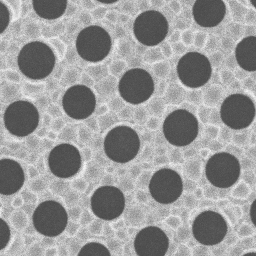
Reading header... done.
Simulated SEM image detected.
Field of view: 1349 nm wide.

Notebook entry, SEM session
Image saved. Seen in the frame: a regular array of holes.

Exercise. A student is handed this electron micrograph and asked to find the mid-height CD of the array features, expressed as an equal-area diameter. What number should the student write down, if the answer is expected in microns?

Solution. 0.187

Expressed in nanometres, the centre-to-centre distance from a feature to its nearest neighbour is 314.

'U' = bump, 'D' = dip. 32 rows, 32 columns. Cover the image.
UUUUDDDDUUUUUUUUUUUUUUUUDDDDUUUU
DUUUDDDDUUUUUUUUUUDDUUUUDDDDUUUU
DUUUUUUUUUUUUUUUUDDDDUUUDDDDUUUU
DUUUUUUUUUUDDUUUUDDDDUUUUUUUUUUU
UUUUUUUUUUDDDDUUUDDDDUUUUUUUUUUU
UUUDDDUUUUDDDDUUUUDDUUUUUUUUUUDD
UUDDDDDUUUDDDDUUUUUUUUUUDUUUUDDD
UUDDDDDUUUUDDUUUUUUUUUDDDDUUUUDD
UUDDDDDUUUUUUUUUUUUUUUDDDDUUUUDD
UUUDDDUUUUUUUUUDDDDUUUDDDDUUUUUU
UUUUUUUUUUUUUUUDDDDUUUUDDDUUUUUU
UUUUUUUUDDDDUUUDDDDUUUUUUUUUUUUU
UUUUUUUUDDDDUUUUDDUUUUUUUUUUDDDU
UDDDUUUUDDDDUUUUUUUUUUUUUUUUDDDD
DDDDDUUUUDDUUUUUUUUUUDDDUUUUDDDD
UDDDDUUUUUUUUUUUUUUUDDDDDUUUDDDU
UDDDUUUUUUUUUUDDDUUUDDDDDUUUUUUU
UUUUUUUUUUUUUDDDDUUUUDDDUUUUUUUU
UUUUUUUDDDUUUDDDDUUUUUUUUUUUUUUU
UUUUUUDDDDUUUDDDDUUUUUUUUUDDDUUU
DDUUUUDDDDUUUUUUUUUUUUUUUUDDDDUU
DDDUUUDDDDUUUUUUUUUUDDUUUUDDDDUU
DDDUUUUUUUUUUUUUUUUDDDDUUUDDDDUU
DDDUUUUUUUUUDDDUUUUDDDDUUUUUUUUU
UUUUUUUUUUUDDDDDUUUDDDUUUUUUUUUU
UUUUUDDDUUUDDDDDUUUUUUUUUUUUUUUD
UUUUDDDDUUUUDDDUUUUUUUUUUDDUUUUD
UUUUDDDDUUUUUDUUUUUUUUUUDDDDUUUD
DUUUDDDDUUUUUUUUUUDDUUUUDDDDUUUU
DUUUUUDUUUUUUUUUUDDDDUUUDDDDUUUU
DUUUUUUUUUUDDUUUUDDDDUUUUDDUUUUU
UUUUUUUUUUDDDDUUUDDDDUUUUUUUUUUU